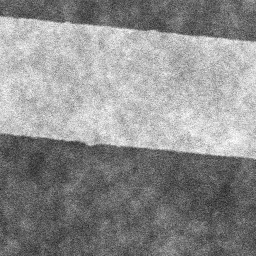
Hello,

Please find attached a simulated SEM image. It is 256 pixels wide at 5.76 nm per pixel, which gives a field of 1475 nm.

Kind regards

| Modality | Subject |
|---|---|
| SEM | one or a few lines or trenches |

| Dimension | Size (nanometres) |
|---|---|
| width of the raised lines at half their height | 666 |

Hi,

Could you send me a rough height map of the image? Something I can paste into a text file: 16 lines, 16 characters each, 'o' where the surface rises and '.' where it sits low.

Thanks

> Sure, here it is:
................
ooooo...........
oooooooooooooo..
oooooooooooooooo
oooooooooooooooo
oooooooooooooooo
oooooooooooooooo
oooooooooooooooo
..oooooooooooooo
............oooo
................
................
................
................
................
................